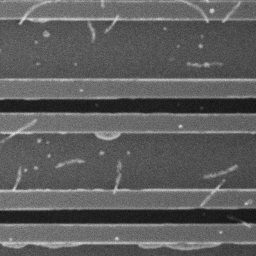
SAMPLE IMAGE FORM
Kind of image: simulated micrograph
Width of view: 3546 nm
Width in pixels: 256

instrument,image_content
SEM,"lines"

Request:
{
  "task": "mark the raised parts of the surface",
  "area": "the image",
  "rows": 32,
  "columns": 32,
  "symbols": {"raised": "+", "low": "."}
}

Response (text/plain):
++++++++++++++++++++++++++++++++
++++++++++++++++++++++++++++++++
..+...........+..........+.++...
................................
................................
................................
................................
................................
................................
................................
++++++++++++++++++++++++++++++++
++++++++++++++++++++++++++++++++
................................
................................
++++++++++++++++++++++++++++++++
++++++++++++++++++++++++++++++++
++++++++++++++++++++++++++++++++
................................
................................
................................
................................
................................
................................
................................
++++++++++++++++++++++++++++++++
++++++++++++++++++++++++++++++++
................................
................................
++++++++++++++++++++++++++++++++
++++++++++++++++++++++++++++++++
................................
................................